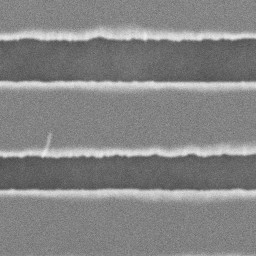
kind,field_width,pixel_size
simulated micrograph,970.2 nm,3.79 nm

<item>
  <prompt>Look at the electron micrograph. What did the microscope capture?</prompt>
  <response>lines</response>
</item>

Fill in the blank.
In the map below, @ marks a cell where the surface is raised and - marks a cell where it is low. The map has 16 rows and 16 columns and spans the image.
@@@@@@@@@@@@@@@@
@@@@@@@@@@@@@@@@
----------------
----------------
----------------
@@@@@@@@@@@@@@@@
@@@@@@@@@@@@@@@@
@@@@@@@@@@@@@@@@
@@@@@@@@@@@@@@@@
@@@@@@@@@@@@@@@@
----------------
----------------
@@@@@@@@@@@@@@@@
@@@@@@@@@@@@@@@@
@@@@@@@@@@@@@@@@
@@@@@@@@@@@@@@@@